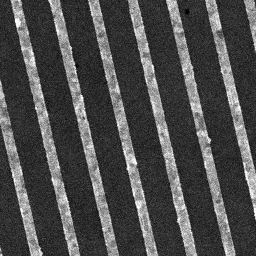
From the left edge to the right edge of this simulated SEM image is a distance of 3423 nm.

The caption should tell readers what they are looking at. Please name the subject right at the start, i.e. parallel lines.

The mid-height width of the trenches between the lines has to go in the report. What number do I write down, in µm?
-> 0.379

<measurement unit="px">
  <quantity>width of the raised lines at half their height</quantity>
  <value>9.61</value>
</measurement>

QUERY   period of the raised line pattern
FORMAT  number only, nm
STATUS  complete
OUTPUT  506